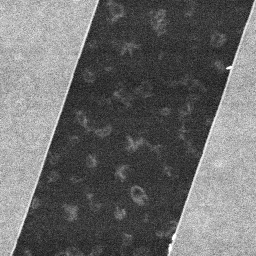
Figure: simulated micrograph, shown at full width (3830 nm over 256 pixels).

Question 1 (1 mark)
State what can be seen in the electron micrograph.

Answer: one or a few lines or trenches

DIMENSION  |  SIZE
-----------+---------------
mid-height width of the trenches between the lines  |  2220 nm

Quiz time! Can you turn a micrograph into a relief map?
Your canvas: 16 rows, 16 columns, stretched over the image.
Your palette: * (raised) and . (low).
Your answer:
******..........
******.........*
*****..........*
*****..........*
*****.........**
****..........**
****..........**
****.........***
***..........***
***..........***
***.........****
**..........****
**..........****
**.........*****
*..........*****
*..........*****